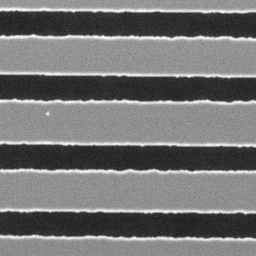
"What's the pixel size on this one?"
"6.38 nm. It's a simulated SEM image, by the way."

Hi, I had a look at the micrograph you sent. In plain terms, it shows lines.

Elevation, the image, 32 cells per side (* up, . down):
********************************
.........................******.
................................
................................
...**...........................
********************************
********************************
********************************
********************************
......................**.*******
................................
................................
.*..............................
********************************
********************************
********************************
********************************
********************************
................................
................................
................................
********************************
********************************
********************************
********************************
********************************
....................**..********
................................
................................
*...*...........................
********************************
********************************